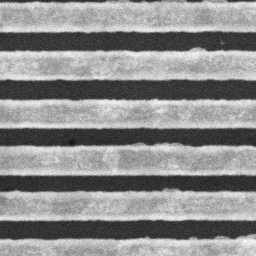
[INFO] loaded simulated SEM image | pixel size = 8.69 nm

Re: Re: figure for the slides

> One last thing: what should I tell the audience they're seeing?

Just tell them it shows lines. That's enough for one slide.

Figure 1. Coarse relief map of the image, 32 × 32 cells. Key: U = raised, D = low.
DUDUUUUUUUUUUUDDUDDUUUDUDUUDUUUU
UUUUUUUUUUUUUUUUUUUUUUUUUUUUUUUU
UUUUUUUUUUUUUUUUUUUUUUUUUUUUUUUU
UUUUUUUUUUUUUUUUUUUUUUUUUUUUUUUU
DDDDDDDDDDDDDDDDDDDDDDDDDDDDDDDD
DDDDDDDDDDDDDDDDDDDDDDDDDDDDDDDD
DDDDDDDDDDDDDDDUDDDDDDDDDDDUUUDD
UUUUUUUUUUUUUUUUUUUUUUUUUUUUUUUU
UUUUUUUUUUUUUUUUUUUUUUUUUUUUUUUU
UUUUUUUUUUUUUUUUUUUUUUUUUUUUUUUU
DDDDDDDDDDDDDDDDDDDDDDDDDDDDDDDD
DDDDDDDDDDDDDDDDDDDDDDDDDDDDDDDD
DDDDDDDDDDDDDDDDDDDDDDDDDDDDDDDD
UUUUUUUUUUUUUUUUUUUUUUUUUUUUUUUU
UUUUUUUUUUUUUUUUUUUUUUUUUUUUUUUU
UUUUUUUUUUUUUUUUUUUUUUUUUUUUUUUU
DDDDDDDDDDDDDDDDDDDDDDDDDDDDDDDD
DDDDDDDDDDDDDDDDDDDDDDDDDDDDDDDD
DDDDDDDDDUUUUUUUUUUDUDDDDDDUUUUU
UUUUUUUUUUUUUUUUUUUUUUUUUUUUUUUU
UUUUUUUUUUUUUUUUUUUUUUUUUUUUUUUU
UUUUUUUUUUUUUUUUUUUUUUUUUUUUUUUU
DDDDDDDDDDDDDDDDDDDDDDDDDDDDDDDD
DDDDDDDDDDDDDDDDDDDDDDDDDDDDDDDD
UUUUUUUUUUUUUUUUUUUUUUUUUUUUUUUU
UUUUUUUUUUUUUUUUUUUUUUUUUUUUUUUU
UUUUUUUUUUUUUUUUUUUUUUUUUUUUUUUU
DDDDDDDDDDDDDDDDDDDDDDDDDDDDDDDD
DDDDDDDDDDDDDDDDDDDDDDDDDDDDDDDD
DDDDDDDDDDDDDDDDDDDDDDDDDDDDDDDD
UUUUUUUUUUUUUUUUUUUUUUUUUUUUUUUU
UUUUUUUUUUUUUUUUUUUUUUUUUUUUUUUU